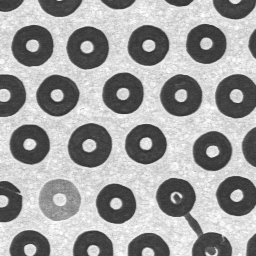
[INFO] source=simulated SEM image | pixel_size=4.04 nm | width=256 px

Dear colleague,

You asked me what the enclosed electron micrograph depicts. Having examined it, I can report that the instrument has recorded a regular array of ring-shaped grooves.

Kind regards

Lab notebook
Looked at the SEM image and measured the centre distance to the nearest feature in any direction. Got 224 nm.